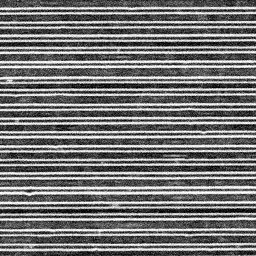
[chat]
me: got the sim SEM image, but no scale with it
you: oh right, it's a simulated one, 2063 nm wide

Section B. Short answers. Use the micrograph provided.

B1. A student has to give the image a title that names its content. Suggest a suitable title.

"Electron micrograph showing parallel lines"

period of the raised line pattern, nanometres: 112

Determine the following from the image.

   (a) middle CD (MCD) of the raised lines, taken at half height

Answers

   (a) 46.4 nm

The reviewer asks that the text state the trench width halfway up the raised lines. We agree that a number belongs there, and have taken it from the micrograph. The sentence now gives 8.62 pixels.